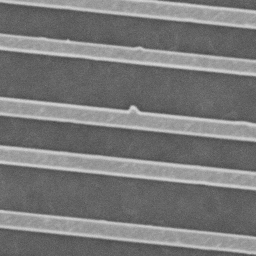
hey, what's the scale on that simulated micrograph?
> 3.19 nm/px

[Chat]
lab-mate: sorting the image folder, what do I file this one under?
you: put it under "parallel lines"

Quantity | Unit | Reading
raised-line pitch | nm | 184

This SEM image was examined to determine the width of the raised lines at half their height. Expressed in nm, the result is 51.1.